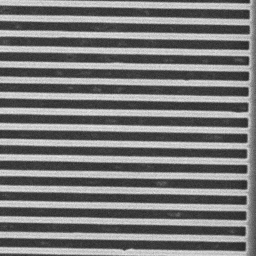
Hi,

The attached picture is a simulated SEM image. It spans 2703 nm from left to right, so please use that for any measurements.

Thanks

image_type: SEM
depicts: parallel lines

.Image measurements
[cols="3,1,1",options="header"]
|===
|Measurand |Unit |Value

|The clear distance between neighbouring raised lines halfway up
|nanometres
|104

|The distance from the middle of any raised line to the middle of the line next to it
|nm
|164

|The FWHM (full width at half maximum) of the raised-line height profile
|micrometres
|0.0528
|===